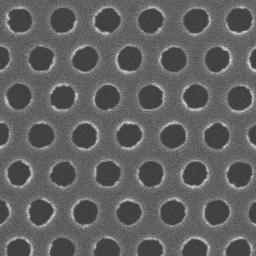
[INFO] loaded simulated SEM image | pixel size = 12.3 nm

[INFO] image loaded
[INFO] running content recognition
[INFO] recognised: a regular array of holes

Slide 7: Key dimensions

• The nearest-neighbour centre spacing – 535 nm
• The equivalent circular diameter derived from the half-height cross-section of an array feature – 24.9 pixels